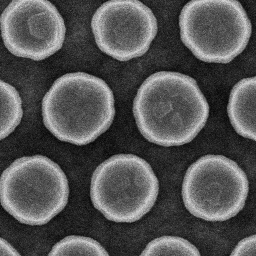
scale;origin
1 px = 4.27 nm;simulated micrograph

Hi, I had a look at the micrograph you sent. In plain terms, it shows raised bodies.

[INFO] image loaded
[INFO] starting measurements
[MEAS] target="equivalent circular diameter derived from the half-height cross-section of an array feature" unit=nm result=278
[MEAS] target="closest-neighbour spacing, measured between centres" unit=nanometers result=388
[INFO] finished